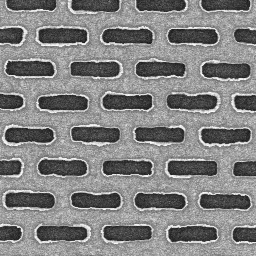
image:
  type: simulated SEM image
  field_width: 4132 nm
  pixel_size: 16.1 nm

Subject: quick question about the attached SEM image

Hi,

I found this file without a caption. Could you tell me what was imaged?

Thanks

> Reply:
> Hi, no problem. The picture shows a regular array of holes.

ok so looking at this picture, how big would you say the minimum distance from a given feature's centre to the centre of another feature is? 739 nanometres